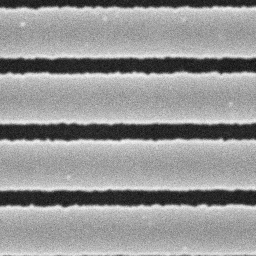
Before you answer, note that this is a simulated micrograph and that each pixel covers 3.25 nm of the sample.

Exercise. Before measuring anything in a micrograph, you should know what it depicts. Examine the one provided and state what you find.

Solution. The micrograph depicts lines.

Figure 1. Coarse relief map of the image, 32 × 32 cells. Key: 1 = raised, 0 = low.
00000000000000000000000000000000
11111111111111111111111111111111
11111111111111111111111111111111
11111111111111111111111111111111
11111111111111111111111111111111
11111111111111111111111111111111
11111111111111111111111111111111
00000000000000000000000000000000
00000000000000000000000000000000
11111111111111111111111111111111
11111111111111111111111111111111
11111111111111111111111111111111
11111111111111111111111111111111
11111111111111111111111111111111
11111111111111111111111111111111
00000100000000000100000000100000
00000000000000000000000000000000
00000000000000000000001010000000
11111111111111111111111111111111
11111111111111111111111111111111
11111111111111111111111111111111
11111111111111111111111111111111
11111111111111111111111111111111
11111111111111111111111111111111
00000000000000000000000000000000
00000000000000000000000000000000
11111111111111111111111111111111
11111111111111111111111111111111
11111111111111111111111111111111
11111111111111111111111111111111
11111111111111111111111111111111
11111111111111111111111111111111